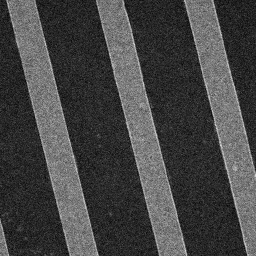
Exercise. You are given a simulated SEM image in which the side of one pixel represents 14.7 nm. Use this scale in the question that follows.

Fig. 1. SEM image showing one or a few lines or trenches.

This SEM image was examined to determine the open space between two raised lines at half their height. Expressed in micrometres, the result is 0.877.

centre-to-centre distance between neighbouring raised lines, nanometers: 1270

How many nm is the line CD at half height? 396